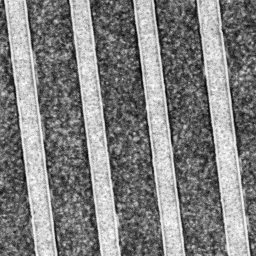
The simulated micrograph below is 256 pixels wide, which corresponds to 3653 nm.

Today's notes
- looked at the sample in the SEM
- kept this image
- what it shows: one or a few lines or trenches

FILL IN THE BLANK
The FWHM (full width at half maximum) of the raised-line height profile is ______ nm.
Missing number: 269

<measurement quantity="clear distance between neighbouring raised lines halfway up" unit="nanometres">639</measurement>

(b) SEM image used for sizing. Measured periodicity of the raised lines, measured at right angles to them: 63.7 pixels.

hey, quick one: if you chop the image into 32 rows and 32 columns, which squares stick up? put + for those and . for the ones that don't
.++......++......++......++.....
.++......++......++......++.....
.++......++......++......+++....
.+++.....++......+++.....+++....
.+++.....+++.....+++.....+++....
.+++.....+++.....+++.....+++....
.+++......++......++.....+++....
..++......++......++......++....
..++......++......++......++....
..++......++......++......++....
..++......++......++......+++...
..+++.....+++.....+++.....+++...
..+++.....+++.....+++.....+++...
..+++.....+++.....+++.....+++...
...++......++......++.....+++...
...++......++......++......++...
...++......++......++......++...
...++......++......++......++...
...++......++......++......++...
...++......++......+++.....+++..
...+++.....+++.....+++.....+++..
...+++.....+++.....+++.....+++..
...+++......++......++.....+++..
....++......++......++......++..
....++......++......++......++..
....++......++......++......++..
....++......++......++......++..
....++......++......++......+++.
....+++.....+++.....+++.....+++.
....+++.....+++.....+++.....+++.
....+++......++......++......++.
.....++......++......++......++.